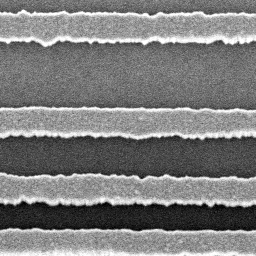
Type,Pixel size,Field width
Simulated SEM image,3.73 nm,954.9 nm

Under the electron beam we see lines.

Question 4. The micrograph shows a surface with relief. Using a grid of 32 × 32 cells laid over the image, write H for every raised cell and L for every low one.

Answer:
LLLLLLLLLLLLLLLLLLLLLLLLLLLLLLLL
LLHLLLLLLLLLLLLLLLLLLLLLLLLLLLLL
HHHHHHHHHHHHHHHHHHHHHHHHHHHHHHHH
HHHHHHHHHHHHHHHHHHHHHHHHHHHHHHHH
HHHHHHHHHHHHHHHHHHHHHHHHHHHHHHHH
LLLLLHLLLLLLLLLLLLLLLLLLLLLLLLLL
LLLLLLLLLLLLLLLLLLLLLLLLLLLLLLLL
LLLLLLLLLLLLLLLLLLLLLLLLLLLLLLLL
LLLLLLLLLLLLLLLLLLLLLLLLLLLLLLLL
LLLLLLLLLLLLLLLLLLLLLLLLLLLLLLLL
LLLLLLLLLLLLLLLLLLLLLLLLLLLLLLLL
LLLLLLLLLLLLLLLLLLLLLLLLLLLLLLLL
LLLLLLLLLLLLLLLLLLLLLLLLLLLLLLLL
LLLHHHLLLLHHLLLLLLLLLLLLLLLLLLLL
HHHHHHHHHHHHHHHHHHHHHHHHHHHHHHHH
HHHHHHHHHHHHHHHHHHHHHHHHHHHHHHHH
HHHHHHHHHHHHHHHHHHHHHHHHHHHHHHHH
LLLLLLLLLLLLLLLLLLLLLLLLLLLLLLLL
LLLLLLLLLLLLLLLLLLLLLLLLLLLLLLLL
LLLLLLLLLLLLLLLLLLLLLLLLLLLLLLLL
LLLLLLLLLLLLLLLLLLLLLLLLLLLLLLLL
LLLLLLLLLLLLLLLLLLLLLLLLLLLLLLLL
HHHHHHHHHHHHHHHHHHHHHHHHHHHHHHHH
HHHHHHHHHHHHHHHHHHHHHHHHHHHHHHHH
HHHHHHHHHHHHHHHHHHHHHHHHHHHHHHHH
LHLLLLHHHHHHLLHHHLHLHHLHHLHHHHHH
LLLLLLLLLLLLLLLLLLLLLLLLLLLLLLLL
LLLLLLLLLLLLLLLLLLLLLLLLLLLLLLLL
LLLLLLLLLLLLLLLLLLLLLLLLLLLLLLLL
HHHHHHHHHHHHHHHHHHHHHHHHHHHHHHHH
HHHHHHHHHHHHHHHHHHHHHHHHHHHHHHHH
HHHHHHHHHHHHHHHHHHHHHHHHHHHHHHHH